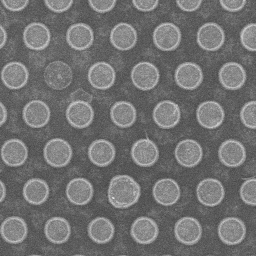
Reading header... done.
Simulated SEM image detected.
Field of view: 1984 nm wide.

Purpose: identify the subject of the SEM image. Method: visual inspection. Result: a regular array of raised bodies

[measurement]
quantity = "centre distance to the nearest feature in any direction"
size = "337 nm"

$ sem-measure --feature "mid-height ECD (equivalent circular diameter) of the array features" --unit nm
201